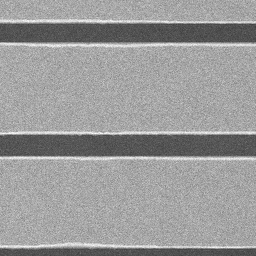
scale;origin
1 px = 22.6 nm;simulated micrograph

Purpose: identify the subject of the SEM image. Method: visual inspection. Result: lines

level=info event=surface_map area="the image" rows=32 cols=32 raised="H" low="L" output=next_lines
HHHHHHHHHHHHHHHHHHHHHHHHHHHHHHHH
HHHHHHHHHHHHHHHHHHHHHHHHHHHHHHHH
HHHHHHHHHHHHHHHHHHHHHHHHHHHHHHHH
LLLLLLLLLLLLLLLLLLLLLLLLLLLLLLLL
LLLLLLLLLLLLLLLLLLLLLLLLLLLLLLLL
HHHHHHHHHHHHHHHHHHHHHHHHHHHHHHHH
HHHHHHHHHHHHHHHHHHHHHHHHHHHHHHHH
HHHHHHHHHHHHHHHHHHHHHHHHHHHHHHHH
HHHHHHHHHHHHHHHHHHHHHHHHHHHHHHHH
HHHHHHHHHHHHHHHHHHHHHHHHHHHHHHHH
HHHHHHHHHHHHHHHHHHHHHHHHHHHHHHHH
HHHHHHHHHHHHHHHHHHHHHHHHHHHHHHHH
HHHHHHHHHHHHHHHHHHHHHHHHHHHHHHHH
HHHHHHHHHHHHHHHHHHHHHHHHHHHHHHHH
HHHHHHHHHHHHHHHHHHHHHHHHHHHHHHHH
HHHHHHHHHHHHHHHHHHHHHHHHHHHHHHHH
HHHHHHHHHHHHHHHHHHHHHHHHHHHHHHHH
LLLLLLLLLLLLLLLLLLLLLLLLLLLLLLLL
LLLLLLLLLLLLLLLLLLLLLLLLLLLLLLLL
LLLLLLLLLLLLLLLLLLLLLLLLLLLLLLLL
HHHHHHHHHHHHHHHHHHHHHHHHHHHHHHHH
HHHHHHHHHHHHHHHHHHHHHHHHHHHHHHHH
HHHHHHHHHHHHHHHHHHHHHHHHHHHHHHHH
HHHHHHHHHHHHHHHHHHHHHHHHHHHHHHHH
HHHHHHHHHHHHHHHHHHHHHHHHHHHHHHHH
HHHHHHHHHHHHHHHHHHHHHHHHHHHHHHHH
HHHHHHHHHHHHHHHHHHHHHHHHHHHHHHHH
HHHHHHHHHHHHHHHHHHHHHHHHHHHHHHHH
HHHHHHHHHHHHHHHHHHHHHHHHHHHHHHHH
HHHHHHHHHHHHHHHHHHHHHHHHHHHHHHHH
HHHHHHHHHHHHHHHHHHHHHHHHHHHHHHHH
LLLLLLLLLLLLLLLLLLLLLLLLLLLLLLLL